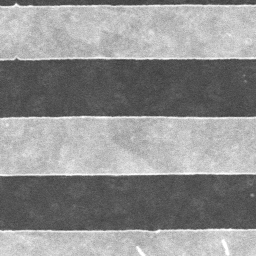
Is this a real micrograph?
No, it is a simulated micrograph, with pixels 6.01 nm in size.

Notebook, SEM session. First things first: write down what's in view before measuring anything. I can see one or a few lines or trenches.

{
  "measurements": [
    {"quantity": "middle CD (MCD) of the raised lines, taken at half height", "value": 327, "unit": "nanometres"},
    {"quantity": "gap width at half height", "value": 346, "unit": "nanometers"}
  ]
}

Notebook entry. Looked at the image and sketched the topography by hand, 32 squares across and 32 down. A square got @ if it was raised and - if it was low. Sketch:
--------------------------------
@@@@@@@@@@@@@@@@@@@@@@@@@@@@@@@@
@@@@@@@@@@@@@@@@@@@@@@@@@@@@@@@@
@@@@@@@@@@@@@@@@@@@@@@@@@@@@@@@@
@@@@@@@@@@@@@@@@@@@@@@@@@@@@@@@@
@@@@@@@@@@@@@@@@@@@@@@@@@@@@@@@@
@@@@@@@@@@@@@@@@@@@@@@@@@@@@@@@@
--------------------------------
--------------------------------
--------------------------------
--------------------------------
--------------------------------
--------------------------------
--------------------------------
--------------------------------
@@@@@@@@@@@@@@@@@@@@@@@@@@@@@@@@
@@@@@@@@@@@@@@@@@@@@@@@@@@@@@@@@
@@@@@@@@@@@@@@@@@@@@@@@@@@@@@@@@
@@@@@@@@@@@@@@@@@@@@@@@@@@@@@@@@
@@@@@@@@@@@@@@@@@@@@@@@@@@@@@@@@
@@@@@@@@@@@@@@@@@@@@@@@@@@@@@@@@
@@@@@@@@@@@@@@@@@@@@@@@@@@@@@@@@
--------------------------------
--------------------------------
--------------------------------
--------------------------------
--------------------------------
--------------------------------
--------------------------------
@@@@@@@@@@@@@@@@@@@@@@@@@@@@@@@@
@@@@@@@@@@@@@@@@@@@@@@@@@@@@@@@@
@@@@@@@@@@@@@@@@@@@@@@@@@@@@@@@@